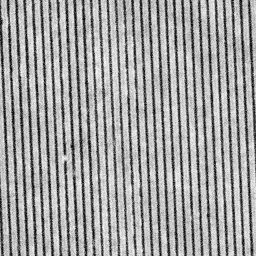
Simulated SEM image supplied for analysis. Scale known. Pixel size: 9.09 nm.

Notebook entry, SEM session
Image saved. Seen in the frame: parallel lines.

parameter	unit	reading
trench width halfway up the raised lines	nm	27.2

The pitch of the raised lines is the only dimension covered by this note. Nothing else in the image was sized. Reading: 75.5 nm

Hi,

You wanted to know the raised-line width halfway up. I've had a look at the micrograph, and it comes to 47.7 nm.